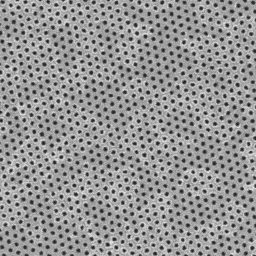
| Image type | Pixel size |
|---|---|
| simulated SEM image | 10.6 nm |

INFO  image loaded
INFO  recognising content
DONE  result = a regular array of holes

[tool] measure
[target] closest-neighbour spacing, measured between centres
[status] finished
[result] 0.0869 um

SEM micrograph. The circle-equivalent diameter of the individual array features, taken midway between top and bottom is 4.65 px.